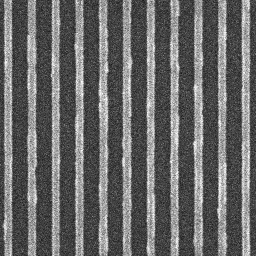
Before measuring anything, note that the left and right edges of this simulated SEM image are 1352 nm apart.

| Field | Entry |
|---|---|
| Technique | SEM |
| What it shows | parallel lines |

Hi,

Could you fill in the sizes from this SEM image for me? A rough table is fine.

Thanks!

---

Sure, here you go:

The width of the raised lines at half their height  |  38.3 nm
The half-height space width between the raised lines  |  85.8 nanometres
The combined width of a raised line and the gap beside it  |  23.8 px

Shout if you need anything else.